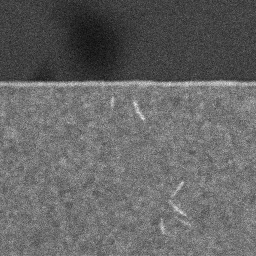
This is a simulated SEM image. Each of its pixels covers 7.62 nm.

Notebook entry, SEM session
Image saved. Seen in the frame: one or a few lines or trenches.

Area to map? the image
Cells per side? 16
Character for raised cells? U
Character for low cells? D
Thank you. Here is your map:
DDDDDDDDDDDDDDDD
DDDDDDDDDDDDDDDD
DDDDDDDDDDDDDDDD
DDDDDDDDDDDDDDDD
DDDDDDDDDDDDDDDD
UUUUUUUUUUUUUUUU
UUUUUUUUUUUUUUUU
UUUUUUUUUUUUUUUU
UUUUUUUUUUUUUUUU
UUUUUUUUUUUUUUUU
UUUUUUUUUUUUUUUU
UUUUUUUUUUUUUUUU
UUUUUUUUUUUUUUUU
UUUUUUUUUUUUUUUU
UUUUUUUUUUUUUUUU
UUUUUUUUUUUUUUUU